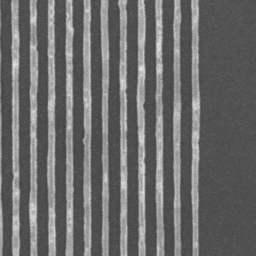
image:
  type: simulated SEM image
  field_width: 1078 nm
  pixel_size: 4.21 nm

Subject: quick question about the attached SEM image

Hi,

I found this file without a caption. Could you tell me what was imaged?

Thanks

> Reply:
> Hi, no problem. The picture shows parallel lines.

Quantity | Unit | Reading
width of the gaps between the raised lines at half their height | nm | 52.1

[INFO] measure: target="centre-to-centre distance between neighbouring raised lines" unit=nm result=75.6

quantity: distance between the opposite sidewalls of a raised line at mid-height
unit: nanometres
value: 24.2